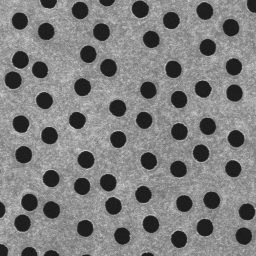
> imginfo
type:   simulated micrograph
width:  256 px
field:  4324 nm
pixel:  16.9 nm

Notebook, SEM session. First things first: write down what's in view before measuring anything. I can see a regular array of holes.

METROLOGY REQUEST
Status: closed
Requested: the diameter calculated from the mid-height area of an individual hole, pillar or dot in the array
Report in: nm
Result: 285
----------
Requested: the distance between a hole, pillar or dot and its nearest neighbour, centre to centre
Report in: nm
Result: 478